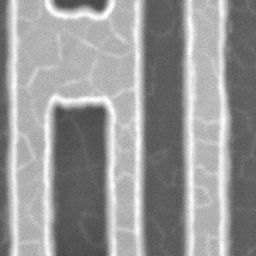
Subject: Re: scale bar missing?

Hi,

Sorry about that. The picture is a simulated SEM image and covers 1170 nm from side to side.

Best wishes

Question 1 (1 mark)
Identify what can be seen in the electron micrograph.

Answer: one or a few lines or trenches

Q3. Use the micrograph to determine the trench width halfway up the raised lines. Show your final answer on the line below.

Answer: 216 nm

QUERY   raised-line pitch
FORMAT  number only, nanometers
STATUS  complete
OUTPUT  399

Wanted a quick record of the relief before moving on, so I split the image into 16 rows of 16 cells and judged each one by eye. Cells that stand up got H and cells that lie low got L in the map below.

LHHHLLLHHLLLHHLL
LHHHHHHHHLLLHHLL
LHHHHHHHHLLLHHLL
LHHHHHHHHLLLHHLL
LHHHHHHHHLLLHHLL
LHHHHHHHHLLLHHLL
LHHHHLHHHLLLHHLL
LHHLLLLHHLLLHHLL
LHHLLLLHHLLLHHLL
LHHLLLLHHLLLHHLL
LHHLLLLHHLLLHHLL
LHHLLLLHHLLLHHLL
LHHLLLLHHLLLHHLL
LHHLLLLHHLLLHHLL
LHHLLLLHHLLLHHLL
LHHLLLLHHLLLHHLL